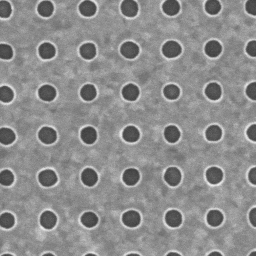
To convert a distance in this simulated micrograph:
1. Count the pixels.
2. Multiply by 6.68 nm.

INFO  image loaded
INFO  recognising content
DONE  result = a regular array of holes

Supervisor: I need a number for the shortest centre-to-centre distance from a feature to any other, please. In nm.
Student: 275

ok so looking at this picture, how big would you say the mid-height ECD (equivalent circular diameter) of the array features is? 125 nm